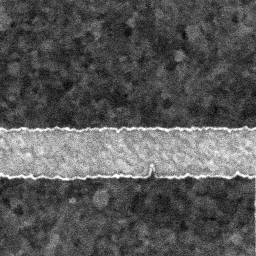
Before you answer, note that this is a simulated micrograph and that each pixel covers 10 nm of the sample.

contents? one or a few lines or trenches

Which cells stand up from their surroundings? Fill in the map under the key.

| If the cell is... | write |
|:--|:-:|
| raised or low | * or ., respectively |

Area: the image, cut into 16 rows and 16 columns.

****************
****************
****************
****************
****************
****************
****************
****************
................
................
................
****************
****************
****************
****************
****************